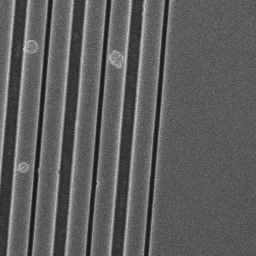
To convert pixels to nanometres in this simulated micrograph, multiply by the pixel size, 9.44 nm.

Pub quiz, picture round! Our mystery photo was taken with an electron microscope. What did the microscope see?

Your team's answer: parallel lines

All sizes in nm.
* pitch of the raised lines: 274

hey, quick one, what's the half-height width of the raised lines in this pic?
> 190 nanometres